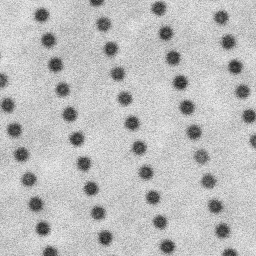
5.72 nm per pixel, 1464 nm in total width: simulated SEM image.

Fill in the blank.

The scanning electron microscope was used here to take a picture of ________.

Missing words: a regular array of ring-shaped grooves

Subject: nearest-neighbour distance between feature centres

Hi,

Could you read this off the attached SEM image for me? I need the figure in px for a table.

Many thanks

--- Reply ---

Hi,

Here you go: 25.6